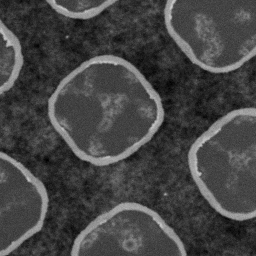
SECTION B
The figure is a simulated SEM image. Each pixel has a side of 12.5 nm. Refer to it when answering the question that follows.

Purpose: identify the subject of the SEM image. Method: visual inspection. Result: raised bodies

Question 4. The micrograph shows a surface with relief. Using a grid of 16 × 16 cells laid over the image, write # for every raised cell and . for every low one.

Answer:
....##.....#####
...........#####
#..........#####
#...........####
#....###........
....#####.......
...#######......
...#######....##
....#####....###
.....###....####
#...........####
##..........####
###..........###
###....###.....#
##...######.....
#....######.....